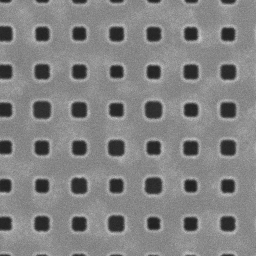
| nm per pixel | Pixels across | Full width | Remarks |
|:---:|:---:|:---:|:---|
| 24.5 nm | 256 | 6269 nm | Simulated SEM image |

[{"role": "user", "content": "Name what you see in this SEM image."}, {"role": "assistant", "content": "a regular array of holes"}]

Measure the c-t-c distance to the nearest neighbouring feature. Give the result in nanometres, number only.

908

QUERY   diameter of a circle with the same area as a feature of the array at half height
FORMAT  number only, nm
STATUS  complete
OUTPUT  420